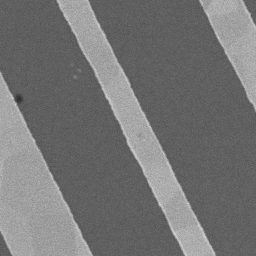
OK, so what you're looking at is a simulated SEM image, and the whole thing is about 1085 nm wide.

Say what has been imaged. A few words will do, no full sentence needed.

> one or a few lines or trenches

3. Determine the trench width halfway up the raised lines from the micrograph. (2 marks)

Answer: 0.359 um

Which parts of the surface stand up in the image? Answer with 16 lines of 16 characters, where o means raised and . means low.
....oo.......oo.
....oo.......ooo
.....oo.......oo
.....oo.......oo
......oo.......o
......oo.......o
o......oo.......
o......oo.......
oo......oo......
oo......oo......
ooo......oo.....
oooo.....oo.....
oooo......oo....
ooooo.....oo....
ooooo......oo...
.ooooo.....oo...